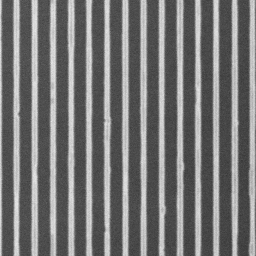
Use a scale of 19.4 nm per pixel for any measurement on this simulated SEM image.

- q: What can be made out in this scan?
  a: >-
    parallel lines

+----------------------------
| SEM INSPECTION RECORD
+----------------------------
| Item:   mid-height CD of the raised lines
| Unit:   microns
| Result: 0.0679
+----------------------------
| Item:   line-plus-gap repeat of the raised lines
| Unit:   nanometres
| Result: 352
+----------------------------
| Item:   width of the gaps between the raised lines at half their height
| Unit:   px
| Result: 15.3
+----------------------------